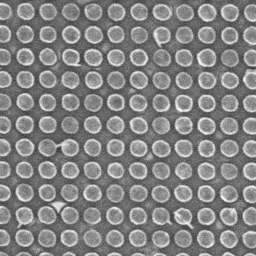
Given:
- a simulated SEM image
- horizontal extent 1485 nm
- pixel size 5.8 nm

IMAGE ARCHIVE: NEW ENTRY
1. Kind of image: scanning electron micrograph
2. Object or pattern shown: a regular array of raised bodies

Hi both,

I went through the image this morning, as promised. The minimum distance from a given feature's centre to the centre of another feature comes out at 130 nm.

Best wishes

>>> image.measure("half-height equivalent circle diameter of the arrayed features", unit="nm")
97.5